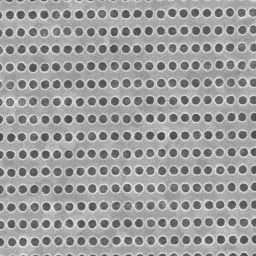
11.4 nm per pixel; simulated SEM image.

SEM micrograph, a regular array of holes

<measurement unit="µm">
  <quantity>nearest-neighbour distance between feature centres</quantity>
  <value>0.13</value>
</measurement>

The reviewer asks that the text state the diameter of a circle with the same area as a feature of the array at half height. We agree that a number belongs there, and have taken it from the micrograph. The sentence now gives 103 nm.